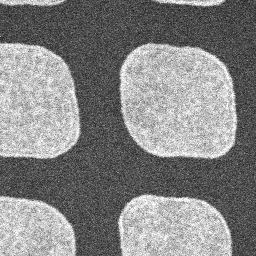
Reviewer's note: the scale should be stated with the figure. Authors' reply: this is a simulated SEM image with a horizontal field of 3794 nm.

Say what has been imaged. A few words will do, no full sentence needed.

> raised bodies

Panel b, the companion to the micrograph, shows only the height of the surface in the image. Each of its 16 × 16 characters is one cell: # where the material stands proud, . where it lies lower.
................
................
................
####....#####...
####....######..
#####...######..
#####...#######.
#####...#######.
#####...#######.
####.....#####..
................
................
#.......####....
####....######..
#####...######..
#####...######..